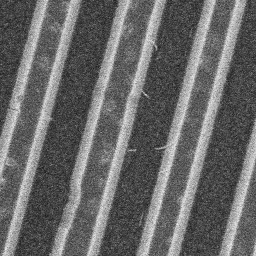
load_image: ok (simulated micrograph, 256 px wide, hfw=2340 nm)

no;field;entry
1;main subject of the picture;one or a few lines or trenches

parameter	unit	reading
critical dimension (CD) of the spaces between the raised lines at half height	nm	426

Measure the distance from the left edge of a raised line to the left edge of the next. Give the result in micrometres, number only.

0.734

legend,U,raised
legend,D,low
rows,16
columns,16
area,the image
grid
DDUUUDDDUUDDDUUD
DDUUDDDUUUDDDUUD
DDUUDDDUUDDDUUDD
DDUUDDDUUDDDUUDD
DUUUDDDUUDDDUUDD
DUUDDDUUUDDDUUDD
DUUDDDUUDDDUUDDD
DUUDDDUUDDDUUDDD
UUUDDUUUDDDUUDDD
UUDDDUUUDDDUUDDD
UUDDDUUDDDUUDDDU
UUDDDUUDDDUUDDDU
UDDDDUUDDDUUDDDU
UDDDUUDDDUUUDDDU
UDDDUUDDDUUDDDUU
UDDDUUDDDUUDDDUU